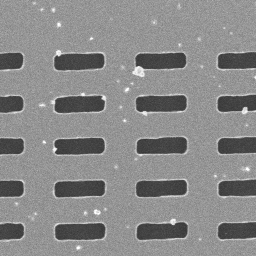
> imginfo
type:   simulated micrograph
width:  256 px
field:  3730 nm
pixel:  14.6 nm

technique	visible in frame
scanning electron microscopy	a regular array of holes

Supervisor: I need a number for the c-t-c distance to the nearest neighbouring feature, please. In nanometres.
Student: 613